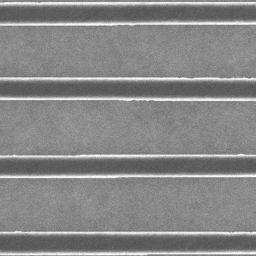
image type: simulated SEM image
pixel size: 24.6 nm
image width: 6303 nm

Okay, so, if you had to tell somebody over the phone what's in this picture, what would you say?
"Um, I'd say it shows lines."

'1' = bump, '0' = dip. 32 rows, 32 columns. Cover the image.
11111111111111111111111111111111
11111111111111111111111111111111
11111111111111111111111111111111
00000000000000000000000000000000
00000000000000000000000000000000
00000000000000000000000000000000
00000000000000000000000000000000
00000000000000000000000000000000
00000000000000000000000000000000
00000000000000000000000000000000
11111111111111111111111111111111
11111111111111111111111111111111
00000000000000000000011111111111
00000000000000000000000000000000
00000000000000000000000000000000
00000000000000000000000000000000
00000000000000000000000000000000
00000000000000000000000000000000
00000000000000000000000000000000
00000000001111111111111111111111
11111111111111111111111111111111
11111111111111111111111111111111
00000000000000000000000000000000
00000000000000000000000000000000
00000000000000000000000000000000
00000000000000000000000000000000
00000000000000000000000000000000
00000000000000000000000000000000
00000000000000000000000000000000
11111111111111111111111111111111
11111111111111111111111111111111
11111111111111111111111111111111